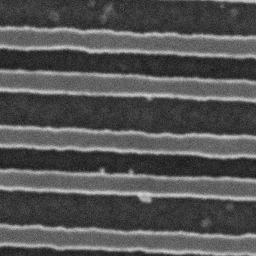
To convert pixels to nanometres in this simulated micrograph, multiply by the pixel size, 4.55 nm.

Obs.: lines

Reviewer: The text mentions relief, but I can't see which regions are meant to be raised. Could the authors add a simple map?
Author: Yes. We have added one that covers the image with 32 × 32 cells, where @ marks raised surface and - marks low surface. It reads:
--------------------------------
--------------------------------
--------------------------------
@@-@----------------------------
@@@@@@@@@@@@@@@@@@@@@@@@@@@-----
@@@@@@@@@@@@@@@@@@@@@@@@@@@@@@@@
-----------@@@@@@@@@@@@@@@@@@@@@
--------------------------------
--------------------------------
@@@@@@@@@@@@@@@@@@--------------
@@@@@@@@@@@@@@@@@@@@@@@@@@@@@@@@
----@@@@@@@@@@@@@@@@@@@@@@@@@@@@
------------------------------@@
--------------------------------
--------------------------------
--------------------------------
@@@@@@@@@@@@@@--@---------------
@@@@@@@@@@@@@@@@@@@@@@@@@@@@@@@@
----@@@@@@@@@@@@@@@@@@@@@@@@@@@@
-------------------------@@@@@@@
--------------------------------
@@@@@@@@------------------------
@@@@@@@@@@@@@@@@@@@@@@@@@@@@@@@@
@@@@@@@@@@@@@@@@@@@@@@@@@@@@@@@@
-------------------@@@@@@@@@@@@@
--------------------------------
--------------------------------
--------------------------------
@@@@@@@@------------------------
@@@@@@@@@@@@@@@@@@@@@@@@@@@@--@@
@@@@@@@@@@@@@@@@@@@@@@@@@@@@@@@@
--------------------@@@@@@@@@@@@